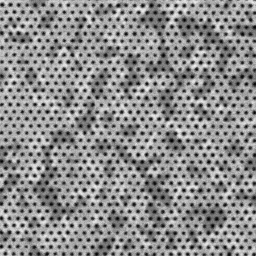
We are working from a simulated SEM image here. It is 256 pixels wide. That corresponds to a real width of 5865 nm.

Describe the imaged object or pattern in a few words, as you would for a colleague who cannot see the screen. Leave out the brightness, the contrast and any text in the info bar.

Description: a regular array of holes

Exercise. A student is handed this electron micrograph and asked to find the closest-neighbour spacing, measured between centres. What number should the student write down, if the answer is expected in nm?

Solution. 182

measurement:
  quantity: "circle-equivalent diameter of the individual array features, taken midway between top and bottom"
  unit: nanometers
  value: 110